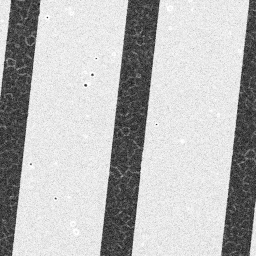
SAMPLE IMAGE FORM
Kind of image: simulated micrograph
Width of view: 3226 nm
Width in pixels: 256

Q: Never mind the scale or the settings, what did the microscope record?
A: one or a few lines or trenches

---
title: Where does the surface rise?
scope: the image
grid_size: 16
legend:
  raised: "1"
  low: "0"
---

1001111100111111
1011111100111110
0011111100111110
0011111100111110
0011111100111110
0011111001111110
0011111001111110
0011111001111110
0011111001111110
0111111001111110
0111111001111100
0111111001111100
0111111001111100
0111111001111100
0111110011111100
0111110011111100